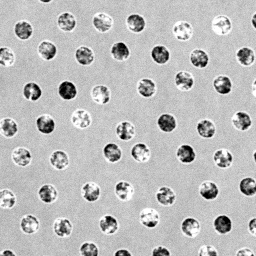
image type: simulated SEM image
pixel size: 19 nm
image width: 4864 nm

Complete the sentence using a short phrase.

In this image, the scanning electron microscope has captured a regular array of holes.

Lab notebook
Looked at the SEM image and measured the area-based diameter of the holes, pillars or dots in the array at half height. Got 347 nm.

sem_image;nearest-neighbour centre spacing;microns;0.63